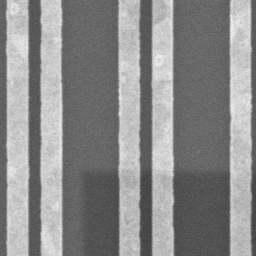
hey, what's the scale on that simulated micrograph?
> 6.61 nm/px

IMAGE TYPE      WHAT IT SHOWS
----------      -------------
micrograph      lines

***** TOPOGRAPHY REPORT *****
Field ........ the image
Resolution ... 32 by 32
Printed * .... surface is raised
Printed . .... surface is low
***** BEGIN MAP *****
.**..***.......**..***.......**.
.**..***.......**..***.......**.
.**..***.......**..***.......**.
.**..***.......**..***.......**.
.**..***.......**..***.......**.
.**..***.......**..***.......**.
.**..***.......**..***.......**.
.**..***.......**..***.......**.
.**..***.......**..***.......**.
.**..***.......**..***.......**.
.**..***.......**..***.......**.
.**..***.......**..***.......**.
.**..***.......**..***.......**.
.**..***.......**..***.......**.
.**..***.......**..***.......**.
.**..***.......**..***.......**.
.**..***.......**..***.......**.
.**..***.......**..***.......**.
.**..***.......**..***.......**.
.**..***.......**..***.......**.
.**..***.......**..***.......**.
.***.***.......**..***.......**.
.***.***.......**..***.......**.
.**..***.......**..***.......**.
.**..***.......**..***.......**.
.**..***.......**..***.......**.
.**..***.......**..***.......**.
.**..***.......**..***.......**.
.**..***.......**..***.......**.
.**..***.......**..***.......**.
.**..***.......**..***.......**.
.**..***.......**..***.......**.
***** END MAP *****